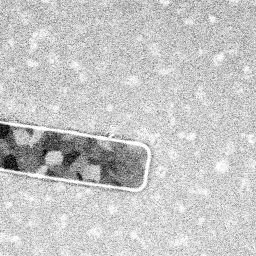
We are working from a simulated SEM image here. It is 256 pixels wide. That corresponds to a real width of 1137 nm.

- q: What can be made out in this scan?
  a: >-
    one or a few lines or trenches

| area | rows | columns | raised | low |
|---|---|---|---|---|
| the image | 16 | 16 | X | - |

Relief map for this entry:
----------------
----------------
----------------
----------------
----------------
----------------
----------------
----------------
XXXXXX----------
XXXXXXXXX-------
XXXXXXXXX-------
------XXX-------
----------------
----------------
----------------
----------------